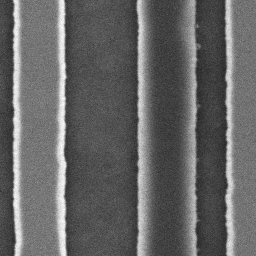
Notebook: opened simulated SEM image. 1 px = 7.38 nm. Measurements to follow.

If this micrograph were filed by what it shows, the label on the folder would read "lines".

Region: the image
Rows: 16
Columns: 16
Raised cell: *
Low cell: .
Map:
.***.....***..**
.***.....***..**
.***.....***..**
.***.....***..**
.***.....***..**
.***.....***..**
.***.....***..**
.***.....***..**
.***.....***..**
.***.....***..**
.***.....***..**
.***.....***..**
.***.....***..**
.***.....***..**
.***.....***..**
.***.....***..**